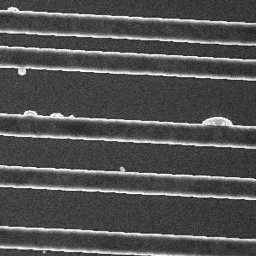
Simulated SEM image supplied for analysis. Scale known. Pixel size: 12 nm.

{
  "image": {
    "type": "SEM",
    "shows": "lines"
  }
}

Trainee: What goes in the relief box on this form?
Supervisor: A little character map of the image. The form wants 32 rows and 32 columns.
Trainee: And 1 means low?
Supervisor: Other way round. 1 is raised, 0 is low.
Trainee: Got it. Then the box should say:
00000000000000000000000000000000
11110000000000000000000000000000
11111111111111111111110000000000
11111111111111111111111111111111
00000000001111111111111111111111
00000000000000000000000000000111
11111111111110000000000000000000
11111111111111111111111111111110
00111111111111111111111111111111
00000000000000000000001111111111
00000000000000000000000000000000
00000000000000000000000000000000
00000000000000000000000000000000
00000000000000000000000000000000
11111000000000000000000000000000
11111111111111111111111000111000
11111111111111111111111111111111
00000000000001111111111111111111
00000000000000000000000000000001
00000000000000000000000000000000
00000000000000000000000000000000
11111111111110000000000000000000
11111111111111111111111111111111
00001111111111111111111111111111
00000000000000000000000011111111
00000000000000000000000000000000
00000000000000000000000000000000
00000000000000000000000000000000
11100000000000000000000000000000
11111111111111111111110000000000
11111111111111111111111111111111
00000000001111111111111111111111